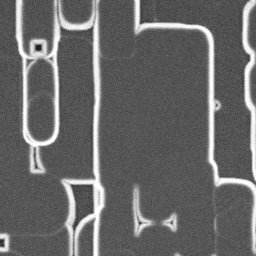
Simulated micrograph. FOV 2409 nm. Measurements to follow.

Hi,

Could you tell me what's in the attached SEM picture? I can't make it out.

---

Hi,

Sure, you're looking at wiring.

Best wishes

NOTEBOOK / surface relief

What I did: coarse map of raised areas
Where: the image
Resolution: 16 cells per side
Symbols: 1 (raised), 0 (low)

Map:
0111111110000000
0111111110000001
0111001111111001
0110001111111000
0011001111111001
0011001111111001
0011001111111000
0011001111111000
0010001111111000
0000001111111000
0000001111111000
0000001111111111
0000001111111111
0000001111111111
0000001111111111
0000001111111111